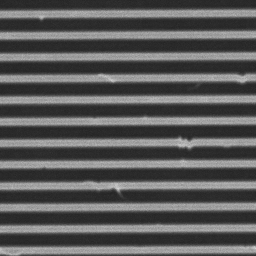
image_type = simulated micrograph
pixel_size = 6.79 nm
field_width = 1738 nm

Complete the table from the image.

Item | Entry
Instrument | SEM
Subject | parallel lines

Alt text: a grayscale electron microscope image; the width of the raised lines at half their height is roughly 56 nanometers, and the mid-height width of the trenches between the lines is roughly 87.5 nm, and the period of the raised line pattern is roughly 146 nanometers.